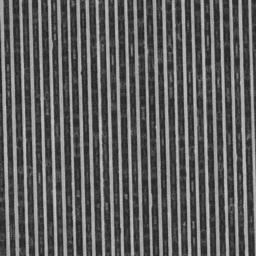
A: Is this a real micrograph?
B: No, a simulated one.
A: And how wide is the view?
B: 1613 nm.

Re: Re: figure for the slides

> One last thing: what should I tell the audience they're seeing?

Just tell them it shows parallel lines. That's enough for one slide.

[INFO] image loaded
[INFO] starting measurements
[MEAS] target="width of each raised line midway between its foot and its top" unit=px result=3.38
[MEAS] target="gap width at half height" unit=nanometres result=42.5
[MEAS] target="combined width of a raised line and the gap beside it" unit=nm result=60.1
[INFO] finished